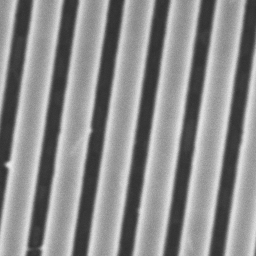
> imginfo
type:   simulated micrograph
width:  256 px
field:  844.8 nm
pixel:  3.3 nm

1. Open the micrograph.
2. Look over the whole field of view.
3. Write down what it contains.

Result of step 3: parallel lines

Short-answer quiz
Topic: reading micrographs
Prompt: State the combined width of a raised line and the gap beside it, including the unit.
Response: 45.2 pixels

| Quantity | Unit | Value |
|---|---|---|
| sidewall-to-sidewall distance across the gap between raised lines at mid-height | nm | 48.2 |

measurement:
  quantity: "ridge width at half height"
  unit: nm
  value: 102